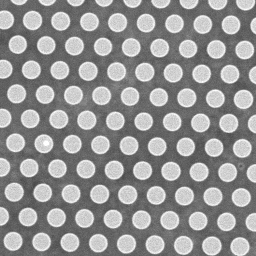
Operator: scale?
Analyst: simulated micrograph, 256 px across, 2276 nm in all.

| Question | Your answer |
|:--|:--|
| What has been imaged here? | an array of small figures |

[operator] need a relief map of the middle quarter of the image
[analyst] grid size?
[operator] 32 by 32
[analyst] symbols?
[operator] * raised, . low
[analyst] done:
*...****...****....***....***...
*...****...****...****...****...
*...****...****...****...*****..
.....***....***...****...****...
...........................*....
................................
.***....***....***.....**....***
*****..*****..*****...****...***
****...*****..*****...****..****
.***....***....***....***....***
..............................**
................................
*...***....***.....**.....**....
*...****...****...****...****...
*...****...****...****...****...
....****...****...****...****...
...................**.....**....
................................
.***....***....**...............
****...****...****...****....***
****...****...****...****...****
****...****...****...****...****
...............**.....***....***
................................
....***....***..................
...*****...***....****...****...
...*****..*****...****..*****...
....***...****....****..*****...
............**....***....***....
................................
.**.....**......................
****...****...****...****....***